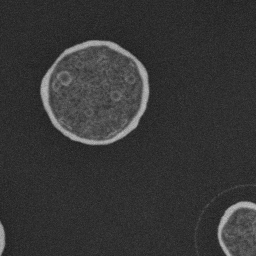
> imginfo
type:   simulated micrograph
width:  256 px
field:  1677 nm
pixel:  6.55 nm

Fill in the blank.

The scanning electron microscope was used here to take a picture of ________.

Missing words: raised bodies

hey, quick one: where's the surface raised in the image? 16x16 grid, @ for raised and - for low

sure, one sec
----------------
----------------
----------------
----@@@@--------
---@@@@@@-------
---@@@@@@-------
---@@@@@@-------
---@@@@@@-------
----@@@@--------
----------------
----------------
----------------
----------------
--------------@@
--------------@@
--------------@@